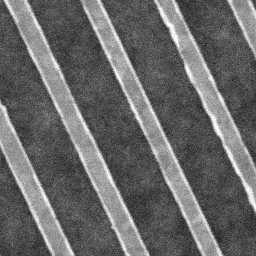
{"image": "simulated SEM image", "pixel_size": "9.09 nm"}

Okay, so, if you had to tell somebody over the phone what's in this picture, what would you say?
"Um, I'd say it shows one or a few lines or trenches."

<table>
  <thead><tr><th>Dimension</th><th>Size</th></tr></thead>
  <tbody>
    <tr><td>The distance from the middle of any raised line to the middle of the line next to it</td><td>67.2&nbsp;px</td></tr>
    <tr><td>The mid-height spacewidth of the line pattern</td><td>454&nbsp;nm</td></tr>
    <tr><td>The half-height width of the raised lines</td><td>159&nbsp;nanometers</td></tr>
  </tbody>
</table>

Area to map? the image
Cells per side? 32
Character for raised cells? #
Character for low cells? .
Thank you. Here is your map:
.##.......###.......##.......##.
.###.......##.......##.......###
..##.......###.......##.......##
..###.......##.......##.......##
...##.......###.......##.......#
...###.......##.......##.......#
....##.......##.......###.......
....###.......##.......##.......
.....##.......###......###......
.....###.......##.......##......
......##.......##.......###.....
......###.......##.......##.....
.......##.......##.......###....
.......##........##.......##....
#.......##.......##.......###...
#.......###.......##.......##...
##.......##.......##.......###..
##.......###.......##.......##..
###.......##.......##.......###.
.##.......###......###.......##.
.###......###.......##.......###
..##.......##.......###.......##
..###.......##.......##.......##
...##.......##.......###.......#
...###......###.......##.......#
....##.......##.......###.......
....###......###.......##.......
.....##.......##.......##.......
.....##.......###.......##......
......##.......##.......###.....
......##.......###.......##.....
......###.......##.......##.....